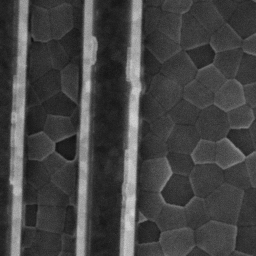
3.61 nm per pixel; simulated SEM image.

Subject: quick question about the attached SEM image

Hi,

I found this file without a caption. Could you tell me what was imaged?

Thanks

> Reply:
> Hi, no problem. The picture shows one or a few lines or trenches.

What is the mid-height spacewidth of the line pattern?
0.233 microns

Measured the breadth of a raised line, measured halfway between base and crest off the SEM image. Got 177 nanometres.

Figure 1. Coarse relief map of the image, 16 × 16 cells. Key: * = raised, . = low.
**....***.......
*.....***.......
*....****.......
*....***........
*....***........
*....****.......
*....***........
*....***........
*....***........
*....***........
*....***........
*....***........
*....***........
*....***........
*....***........
*....***........